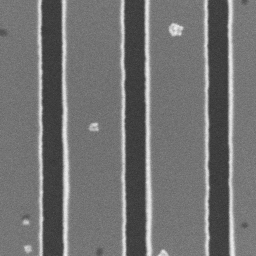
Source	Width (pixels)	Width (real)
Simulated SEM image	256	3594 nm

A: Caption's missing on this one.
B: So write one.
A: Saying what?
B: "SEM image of lines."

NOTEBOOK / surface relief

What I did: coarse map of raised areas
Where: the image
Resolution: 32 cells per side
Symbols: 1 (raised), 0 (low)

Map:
11111000111111100011111111000111
11111000111111100011111111000111
11111000111111100011111111000111
11111000111111100011111111000111
11111000111111100011111111000111
11111000111111100011111111000111
11111000111111100011111111000111
11111000111111100011111111000111
11111000111111110011111111000111
11111000111111110011111111000111
11111000111111100011111111000111
11111000111111110011111111000111
11111000111111110011111111000111
11111000111111110011111111000111
11111000111111110011111111000111
11111000111111100011111111000111
11111000111111110011111111000111
11111000111111110011111111000111
11111000111111110011111111000111
11111000111111110011111111000111
11111000111111110011111111000111
11111000111111110011111111000111
11111000111111110011111111000111
11111000111111110011111111000111
11111000111111110011111111000111
11111000111111110011111111000111
11111000111111110011111111000111
11111000111111110011111111000111
11111000111111110011111111000111
11111000111111110011111111000111
11111000111111110011111111000111
11111000111111110011111111000111